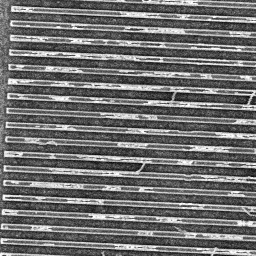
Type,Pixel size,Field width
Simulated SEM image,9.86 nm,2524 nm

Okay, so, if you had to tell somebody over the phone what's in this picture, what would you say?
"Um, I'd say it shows parallel lines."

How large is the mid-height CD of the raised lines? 51.7 nm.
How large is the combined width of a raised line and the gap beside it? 143 nm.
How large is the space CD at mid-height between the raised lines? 94.8 nm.